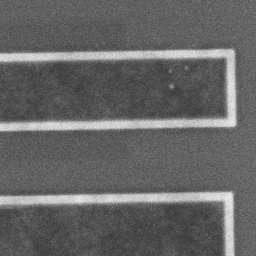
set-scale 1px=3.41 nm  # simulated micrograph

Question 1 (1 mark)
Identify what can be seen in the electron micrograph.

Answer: one or a few lines or trenches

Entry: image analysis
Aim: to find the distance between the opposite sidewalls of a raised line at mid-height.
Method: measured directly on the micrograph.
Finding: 242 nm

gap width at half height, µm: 0.245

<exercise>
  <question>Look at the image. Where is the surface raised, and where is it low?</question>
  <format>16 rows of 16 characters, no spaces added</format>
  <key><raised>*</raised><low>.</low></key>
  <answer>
................
................
................
....**********..
**************..
***************.
***************.
**************..
................
................
................
................
.*************..
**************..
**************..
**************..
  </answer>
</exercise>